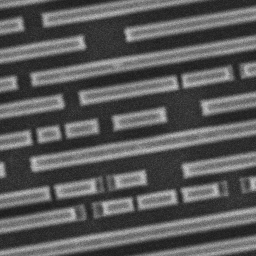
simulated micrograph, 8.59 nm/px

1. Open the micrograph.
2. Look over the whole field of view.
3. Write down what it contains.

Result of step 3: parallel lines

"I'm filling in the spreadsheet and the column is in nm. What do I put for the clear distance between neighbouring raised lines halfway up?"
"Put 142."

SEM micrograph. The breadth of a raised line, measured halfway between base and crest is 12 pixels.